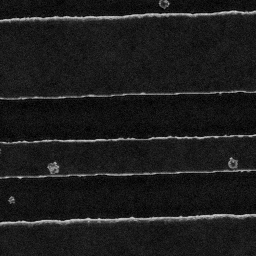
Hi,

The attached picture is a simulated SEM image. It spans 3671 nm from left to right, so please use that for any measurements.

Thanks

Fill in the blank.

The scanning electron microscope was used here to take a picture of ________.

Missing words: lines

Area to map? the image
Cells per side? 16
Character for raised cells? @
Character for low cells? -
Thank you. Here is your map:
----------------
@@@@@@@@@@@@@@@@
@@@@@@@@@@@@@@@@
@@@@@@@@@@@@@@@@
@@@@@@@@@@@@@@@@
@@@@@@@@@@@@@@@@
----------------
----------------
--------------@@
@@@@@@@@@@@@@@@@
@@@@@@@@@@@@@@@@
----------------
----------------
------------@@@@
@@@@@@@@@@@@@@@@
@@@@@@@@@@@@@@@@